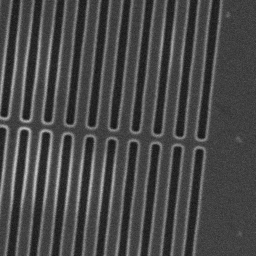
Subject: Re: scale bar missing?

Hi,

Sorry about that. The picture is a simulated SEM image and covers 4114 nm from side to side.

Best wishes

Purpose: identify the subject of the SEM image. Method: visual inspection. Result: groups of lines, slits or small figures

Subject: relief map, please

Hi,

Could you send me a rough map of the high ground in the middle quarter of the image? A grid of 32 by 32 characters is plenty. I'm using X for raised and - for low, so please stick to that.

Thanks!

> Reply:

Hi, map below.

XX--XXX---XXX--XXX---XXX--XXX---
XX--XXX---XXX--XXX---XXX--XXX---
XX--XXX--XXXX--XXX---XXX--XXX---
XX--XXX--XXXX--XXX---XXX--XXX--X
X---XXX--XXX---XXX--XXX---XXX--X
X---XXX--XXX---XXX--XXX---XXX--X
X---XXX--XXX---XXX--XXX---XXX--X
X--XXX---XXX---XXX--XXX---XXX--X
X--XXX---XXX--XXXX--XXX---XXX--X
X--XXX---XXX--XXXX--XXX--XXX---X
X--XXX---XXX--XXX---XXX--XXX---X
X--XXX---XXX--XXX---XXX--XXX---X
---XXX---XX---XXX---XXX--XXX---X
---XXX--XXX---XXX--XXXX--XXX--XX
---XXX--XXX---XXX--XXX---XXX--XX
XXXXXX--XXX---XXX--XXX---XXX--XX
XXXXXXXXXXXX-XXXX--XXX---XXX--XX
-XXXXXXXXXXXXXXXXXXXXXX-XXXX--XX
--XXXX-XXXXXXXXXXXXXXXXXXXXXXXXX
--XXX---XXX--XXX--XXXXXXXXXXXXXX
--XXX---XXX--XXX---XXX--XXXX-XXX
--XXX--XXXX--XXX---XXX--XXX---XX
--XXX--XXXX--XXX---XXX--XXX---XX
--XXX--XXX---XXX--XXX---XXX--XXX
--XXX--XXX---XXX--XXX---XXX--XXX
--XX---XXX---XXX--XXX---XXX--XXX
--XX---XXX--XXXX--XXX--XXXX--XXX
--XX---XXX--XXXX--XXX--XXXX--XXX
-XXX---XXX--XXX---XXX--XXX---XXX
-XXX---XXX--XXX---XXX--XXX---XXX
-XXX---XX---XXX---XXX--XXX---XXX
-XXX---XX---XXX---XXX--XXX--XXXX